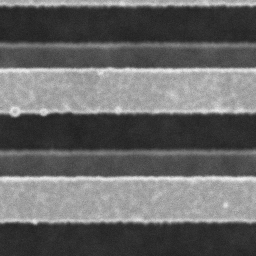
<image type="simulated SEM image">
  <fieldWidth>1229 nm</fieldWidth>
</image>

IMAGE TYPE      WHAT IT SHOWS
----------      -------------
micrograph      lines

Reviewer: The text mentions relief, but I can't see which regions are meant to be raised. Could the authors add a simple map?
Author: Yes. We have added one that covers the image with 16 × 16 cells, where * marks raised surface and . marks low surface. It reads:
................
................
................
****************
****************
****************
****************
................
................
........*..**..*
****************
****************
****************
****************
................
................